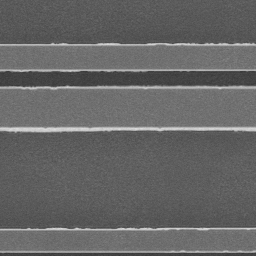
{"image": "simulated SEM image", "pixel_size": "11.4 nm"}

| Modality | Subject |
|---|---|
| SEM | lines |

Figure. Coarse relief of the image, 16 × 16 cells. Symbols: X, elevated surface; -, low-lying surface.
----------------
----------------
----------------
XXXXXXXXXXXXXXXX
XXXXXXXXXXXXXXXX
XXXXXXXXXXXXXXXX
XXXXXXXXXXXXXXXX
XXXXXXXXXXXXXXXX
----------------
----------------
----------------
----------------
----------------
----------------
XXXXXXXXXXXXXXXX
XXXXXXXXXXXXXXXX